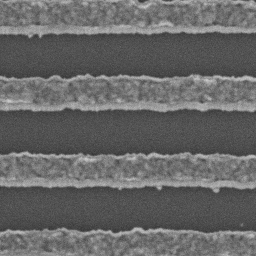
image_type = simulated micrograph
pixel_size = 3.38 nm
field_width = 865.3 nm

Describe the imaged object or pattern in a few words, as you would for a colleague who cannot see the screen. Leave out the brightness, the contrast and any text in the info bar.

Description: lines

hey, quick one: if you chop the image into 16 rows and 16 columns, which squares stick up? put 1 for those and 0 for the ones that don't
1111111111111111
1111111111111111
0000000000000000
0000000000000000
0000000000000000
1111111111111111
1111111111111111
0000000000000000
0000000000000000
0000000000000000
1111111111111111
1111111111111111
0000000000000000
0000000000000000
1111111011110011
1111111111111111